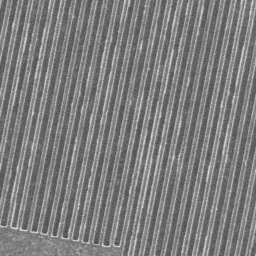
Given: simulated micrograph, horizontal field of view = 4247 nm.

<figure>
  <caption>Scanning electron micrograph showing parallel lines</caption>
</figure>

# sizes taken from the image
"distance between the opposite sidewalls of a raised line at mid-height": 73.3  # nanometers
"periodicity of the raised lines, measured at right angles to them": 10.5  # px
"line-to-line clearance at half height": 0.102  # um